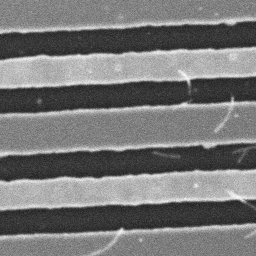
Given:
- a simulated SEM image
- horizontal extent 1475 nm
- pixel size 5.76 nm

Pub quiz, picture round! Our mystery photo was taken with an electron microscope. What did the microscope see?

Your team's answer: lines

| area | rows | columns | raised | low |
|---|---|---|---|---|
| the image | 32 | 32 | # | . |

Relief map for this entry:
################################
################################
################################
#############...................
................................
................................
...................#############
.###############################
################################
###############################.
##########......................
................................
................................
.................###############
################################
################################
################################
################################
##################..............
................................
................................
........................########
...#.###########################
################################
################################
##############.###..............
................................
................................
.......................#########
..##############################
################################
################################